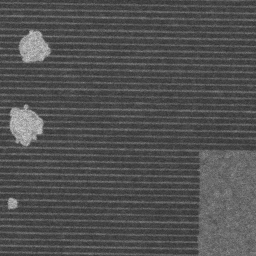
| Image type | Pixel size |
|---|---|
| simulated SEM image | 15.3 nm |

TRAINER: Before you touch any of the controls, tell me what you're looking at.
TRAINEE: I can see parallel lines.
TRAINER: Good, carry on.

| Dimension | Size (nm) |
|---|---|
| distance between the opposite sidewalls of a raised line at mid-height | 21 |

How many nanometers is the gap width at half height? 84.1